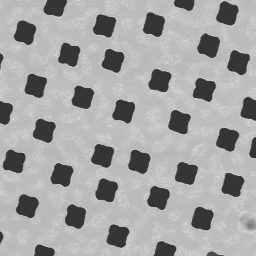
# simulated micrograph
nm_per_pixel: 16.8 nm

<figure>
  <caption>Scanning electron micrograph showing a regular array of holes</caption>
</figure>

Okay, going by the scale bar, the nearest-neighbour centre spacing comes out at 723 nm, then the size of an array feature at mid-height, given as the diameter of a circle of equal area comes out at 0.37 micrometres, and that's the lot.